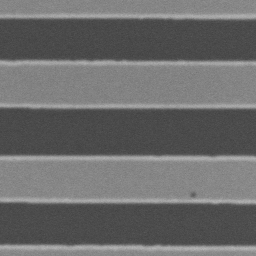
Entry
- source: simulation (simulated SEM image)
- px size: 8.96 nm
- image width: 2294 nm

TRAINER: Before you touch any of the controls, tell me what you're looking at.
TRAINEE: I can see lines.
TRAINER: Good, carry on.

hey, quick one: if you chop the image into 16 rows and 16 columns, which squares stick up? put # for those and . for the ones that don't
################
................
................
................
################
################
################
................
................
................
################
################
################
................
................
################